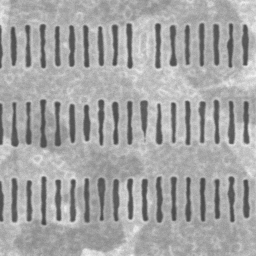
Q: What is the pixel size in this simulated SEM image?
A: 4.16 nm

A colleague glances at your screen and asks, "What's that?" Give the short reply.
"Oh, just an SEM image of a regular array of holes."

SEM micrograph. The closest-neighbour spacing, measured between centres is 60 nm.